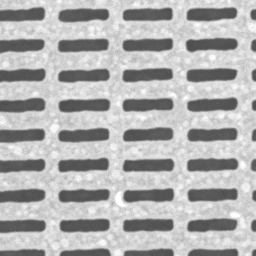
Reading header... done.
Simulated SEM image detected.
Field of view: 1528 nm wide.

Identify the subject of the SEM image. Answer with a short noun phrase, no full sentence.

a regular array of holes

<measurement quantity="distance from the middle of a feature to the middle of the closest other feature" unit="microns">0.179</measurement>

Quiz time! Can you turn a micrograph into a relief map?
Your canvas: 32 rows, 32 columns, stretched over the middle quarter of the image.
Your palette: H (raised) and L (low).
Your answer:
HHHHHHHHHHHHHHHHHHHHHHHHHHHHHHHH
HLHLLHHLLLLHHHHLLLLLLLLLLLLHHHHL
LLLLLLLLLLLLHHHLLLLLLLLLLLLHHHLL
LLLLLLLLLLLHHHHLLLLLLLLLLLLHHHLL
LLLLHHHHHHHHHHHLLLHHHHHHHHHHHHHL
HHHHHHHHHHHHHHHHHHHHHHHHHHHHHHHH
HHHHHHHHHHHHHHHHHHHHHHHHHHHHHHHH
HHHHHHHHHHHHHHHHHHHHHHHHHHHHHHHH
HHHHHHHHLLHHHHHHHHHHHHHHLLLHHHHH
LLLLLLLLLLLLHHHLLLLLLLLLLLLHHHHL
LLLLLLLLLLLLHHHLLLLLLLLLLLLLHHHL
LLLLLLLLLLLHHHHLLLLLLLLLLLLHHHHL
HHHHHHHHHHHHHHHHHHHHHHHHHHHHHHHH
HHHHHHHHHHHHHHHHHHHHHHHHHHHHHHHH
HHHHHHHHHHHHHHHHHHHHHHHHHHHHHHHH
HHHHHHHHHHHHHHHHHHHHHHHHHHHHHHHH
LLLLLLLLLLLHHHHHLLLLLLLLLLLHHHHL
LLLLLLLLLLLHHHHLLLLLLLLLLLLLHHHL
LLLLLLLLLLLHHHHLLLLLLLLLLLLHHHHL
LLLLHHHHHHHHHHHHLLLHHHHHHHHHHHHH
HHHHHHHHHHHHHHHHHHHHHHHHHHHHHHHH
HHHHHHHHHHHHHHHHHHHHHHHHHHHHHHHH
HHHHHHHHHHHHHHHHHHHHHHHHHHHHHHHH
HHHHHHHHHLLHHHHHHHHHHHHHHHHHHHHH
LLLLLLLLLLLHHHHLLLLLLLLLLLLLHHHL
LLLLLLLLLLLHHHHLLLLLLLLLLLLLHHHL
LLLLLLLLLLLHHHHLLLLLLLLLLLLHHHHL
HHHHHHHHHHHHHHHHHHHHHHHHHHHHHHHH
HHHHHHHHHHHHHHHHHHHHHHHHHHHHHHHH
HHHHHHHHHHHHHHHHHHHHHHHHHHHHHHHH
HHHHHHHHHHHHHHHHHHHHHHHHHHHHHHHH
LLLLLLLLLLLHHHHHHLHHLLLLLLLHHHHL